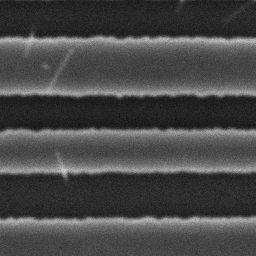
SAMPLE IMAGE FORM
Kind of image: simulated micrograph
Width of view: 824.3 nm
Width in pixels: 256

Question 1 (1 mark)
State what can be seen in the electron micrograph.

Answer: lines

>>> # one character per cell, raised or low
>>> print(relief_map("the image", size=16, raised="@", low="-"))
----------------
----------------
@@@@@@@@@@@@@@@@
@@@@@@@@@@@@@@@@
@@@@@@@@@@@@@@@@
@@@@@@@@@@@@@@@@
----------------
----------------
@@@@@@@@@@@@@@@@
@@@@@@@@@@@@@@@@
@@@@@@@@@@@@@@@@
----------------
----------------
----------------
@@@@@@@@@@@@@@@@
@@@@@@@@@@@@@@@@